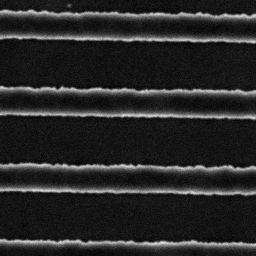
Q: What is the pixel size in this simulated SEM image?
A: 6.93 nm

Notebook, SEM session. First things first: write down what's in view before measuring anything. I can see lines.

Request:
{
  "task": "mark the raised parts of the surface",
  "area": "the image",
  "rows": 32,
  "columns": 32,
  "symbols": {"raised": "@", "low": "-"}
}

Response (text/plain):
--------------------------------
@@@@-@--------------------------
@@@@@@@@@@@@@@@@@@@@@@@@@@@@@@@@
@@@@@@@@@@@@@@@@@@@@@@@@@@@@@@@@
@@@@@@@@@@@@@@@@@@@@@@@@@@@@@@@@
--------------------------------
--------------------------------
--------------------------------
--------------------------------
--------------------------------
--------------------------------
@@@@@@@@@@@@@@@@@@@@@@@@@@@@@@@@
@@@@@@@@@@@@@@@@@@@@@@@@@@@@@@@@
@@@@@@@@@@@@@@@@@@@@@@@@@@@@@@@@
-------------@----@-@@@@@@@@@@@@
--------------------------------
--------------------------------
--------------------------------
--------------------------------
--------------------------------
--------------------------------
@@@@@@@@@@@@@@@@@@@@@@@@@@@@@@@@
@@@@@@@@@@@@@@@@@@@@@@@@@@@@@@@@
@@@@@@@@@@@@@@@@@@@@@@@@@@@@@@@@
--------------------------------
--------------------------------
--------------------------------
--------------------------------
--------------------------------
--------------------------------
@@@@@@@@@@@@@@@@@@@@@@@@@@@@@@@-
@@@@@@@@@@@@@@@@@@@@@@@@@@@@@@@@